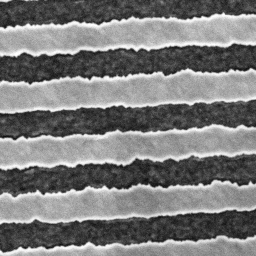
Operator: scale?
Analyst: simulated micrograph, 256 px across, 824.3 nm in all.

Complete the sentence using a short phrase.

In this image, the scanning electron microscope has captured lines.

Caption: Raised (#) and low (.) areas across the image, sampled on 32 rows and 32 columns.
................................
................................
...............#################
################################
################################
#############################.##
##########......................
................................
................................
................################
################################
################################
################################
##########......................
................................
................................
..............##################
################################
################################
########################.#......
###########...##................
................................
................................
...........#....################
################################
################################
###########################.....
###########.##..................
................................
................................
...........#..#..###############
.###############################